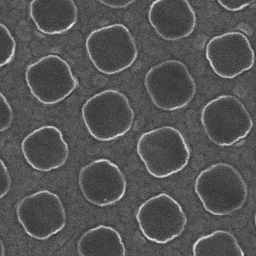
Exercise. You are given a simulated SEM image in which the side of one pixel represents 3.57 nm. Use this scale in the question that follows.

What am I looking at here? a regular array of raised bodies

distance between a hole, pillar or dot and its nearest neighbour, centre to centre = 66.4 pixels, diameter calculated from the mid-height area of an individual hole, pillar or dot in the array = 173 nm